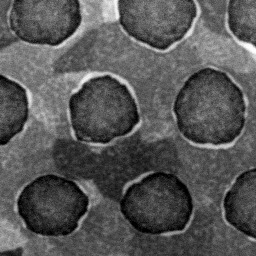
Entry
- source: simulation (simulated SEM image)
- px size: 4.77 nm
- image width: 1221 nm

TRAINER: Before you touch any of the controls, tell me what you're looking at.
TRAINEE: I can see holes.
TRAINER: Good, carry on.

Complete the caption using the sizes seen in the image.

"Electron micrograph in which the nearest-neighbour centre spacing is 0.509 microns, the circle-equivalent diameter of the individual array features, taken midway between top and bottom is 329 nanometres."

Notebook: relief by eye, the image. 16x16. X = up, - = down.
X----XX-----XX--
X----XXX----XX--
X---XXXX---XXXX-
XXXXXXXXXXXXXXXX
XXXXXXXXXXXX--XX
-XXXX---XXX----X
--XX-----XX----X
--XX-----XX----X
-XXXX---XXX----X
XXXXXXXXXXXXXXXX
XXXXXXXXXXXXXXXX
XX---XXX----XXX-
X-----XX----XX--
X----XXX----XX--
XX---XXXX--XXXX-
XXXXXXXXXXXXXXXX